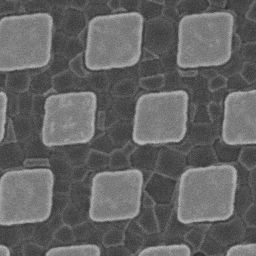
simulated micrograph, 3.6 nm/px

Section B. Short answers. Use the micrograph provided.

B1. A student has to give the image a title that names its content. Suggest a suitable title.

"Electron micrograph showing raised bodies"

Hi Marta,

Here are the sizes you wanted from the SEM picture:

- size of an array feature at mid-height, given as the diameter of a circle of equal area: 0.213 um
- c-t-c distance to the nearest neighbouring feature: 322 nm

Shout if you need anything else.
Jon